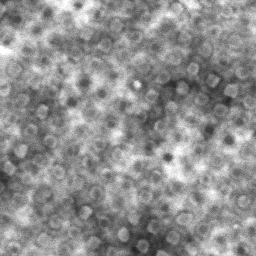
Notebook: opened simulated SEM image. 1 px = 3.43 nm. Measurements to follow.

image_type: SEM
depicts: a regular array of raised bodies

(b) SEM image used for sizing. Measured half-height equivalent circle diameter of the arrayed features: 39.9 nm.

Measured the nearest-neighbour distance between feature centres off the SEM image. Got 73.8 nm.